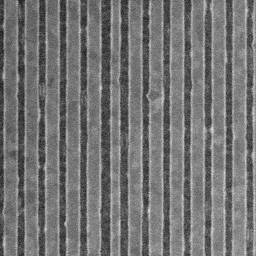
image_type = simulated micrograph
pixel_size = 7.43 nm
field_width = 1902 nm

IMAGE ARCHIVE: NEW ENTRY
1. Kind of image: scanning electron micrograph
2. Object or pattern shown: parallel lines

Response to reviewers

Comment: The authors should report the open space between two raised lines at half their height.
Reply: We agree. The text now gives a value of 0.0548 microns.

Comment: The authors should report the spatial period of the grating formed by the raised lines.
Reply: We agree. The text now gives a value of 154 nm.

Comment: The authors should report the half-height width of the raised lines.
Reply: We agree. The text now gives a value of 96.6 nanometres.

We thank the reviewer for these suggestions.